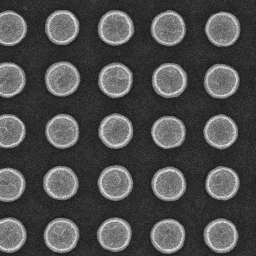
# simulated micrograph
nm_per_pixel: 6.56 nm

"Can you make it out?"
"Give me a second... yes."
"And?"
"a regular array of raised bodies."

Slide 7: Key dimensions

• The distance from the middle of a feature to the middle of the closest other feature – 339 nanometers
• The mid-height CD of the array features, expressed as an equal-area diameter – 0.211 microns